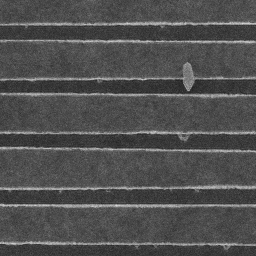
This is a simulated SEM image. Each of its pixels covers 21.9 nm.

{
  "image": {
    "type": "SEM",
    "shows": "lines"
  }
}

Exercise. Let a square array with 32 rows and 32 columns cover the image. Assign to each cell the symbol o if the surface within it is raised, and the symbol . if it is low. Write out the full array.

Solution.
oooooooooooooooooooooooooooooooo
oooooooooooooooooooooooooooooooo
oooooooooooooooooooooooooooooooo
................................
................................
oooooooooooooooooooooooooooooooo
oooooooooooooooooooooooooooooooo
oooooooooooooooooooooooooooooooo
oooooooooooooooooooooooooooooooo
oooooooooooooooooooooooooooooooo
.......................o........
................................
oooooooooooooooooooooooooooooooo
oooooooooooooooooooooooooooooooo
oooooooooooooooooooooooooooooooo
oooooooooooooooooooooooooooooooo
oooooooooooooooooooooooooooooooo
................................
.o..............................
oooooooooooooooooooooooooooooooo
oooooooooooooooooooooooooooooooo
oooooooooooooooooooooooooooooooo
oooooooooooooooooooooooooooooooo
ooooooooooooooooooooooo.........
................................
................................
oooooooooooooooooooooooooooooooo
oooooooooooooooooooooooooooooooo
oooooooooooooooooooooooooooooooo
oooooooooooooooooooooooooooooooo
..........oooooooooooooooooooooo
................................